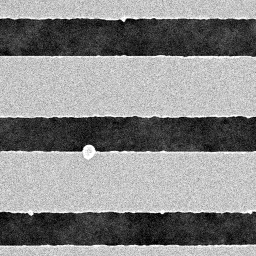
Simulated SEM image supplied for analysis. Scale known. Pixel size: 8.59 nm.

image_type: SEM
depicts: lines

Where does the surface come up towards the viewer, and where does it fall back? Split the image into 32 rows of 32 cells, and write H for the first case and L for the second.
HHHHHHHHHHHHHHHHHHHHHHHHHHHHHHHH
HHHHHHHHHHHHHHHHHHHHHHHHHHHHHHHH
LLLLLLLLLLLLLLLLLLLLLLLLLLLLLLLL
LLLLLLLLLLLLLLLLLLLLLLLLLLLLLLLL
LLLLLLLLLLLLLLLLLLLLLLLLLLLLLLLL
LLLLLLLLLLLLLLLLLLLLLLLLLLLLLLLL
LLLLLLLLLLLLLLLLLLLLLLLLLLLLLLLL
HHHHHHHHHHHHHHHHHHHHHHHHHHHHHHHH
HHHHHHHHHHHHHHHHHHHHHHHHHHHHHHHH
HHHHHHHHHHHHHHHHHHHHHHHHHHHHHHHH
HHHHHHHHHHHHHHHHHHHHHHHHHHHHHHHH
HHHHHHHHHHHHHHHHHHHHHHHHHHHHHHHH
HHHHHHHHHHHHHHHHHHHHHHHHHHHHHHHH
HHHHHHHHHHHHHHHHHHHHHHHHHHHHHHHH
HHHHHHHHHHHHHHHHHHHHHHHHHHHHHHHH
LLLLLLLLLLLLLLLLLLLLLLLLLLLLLLLL
LLLLLLLLLLLLLLLLLLLLLLLLLLLLLLLL
LLLLLLLLLLLLLLLLLLLLLLLLLLLLLLLL
LLLLLLLLLLLHLLLLLLLLLLLLLLLLLLLL
HHHHHHHHHHHHHHHHHHHHHHHHHHHHHHHH
HHHHHHHHHHHHHHHHHHHHHHHHHHHHHHHH
HHHHHHHHHHHHHHHHHHHHHHHHHHHHHHHH
HHHHHHHHHHHHHHHHHHHHHHHHHHHHHHHH
HHHHHHHHHHHHHHHHHHHHHHHHHHHHHHHH
HHHHHHHHHHHHHHHHHHHHHHHHHHHHHHHH
HHHHHHHHHHHHHHHHHHHHHHHHHHHHHHHH
LHHHHLHHHHHLHLLHLLLHHLLLHLLHLLHL
LLLLLLLLLLLLLLLLLLLLLLLLLLLLLLLL
LLLLLLLLLLLLLLLLLLLLLLLLLLLLLLLL
LLLLLLLLLLLLLLLLLLLLLLLLLLLLLLLL
LLLLLLLLLLLLLLLLLLLLLLLLLLLLLLLL
HHHHHHHHHHHHHHHHHHHHHHHHHHHHHHHH